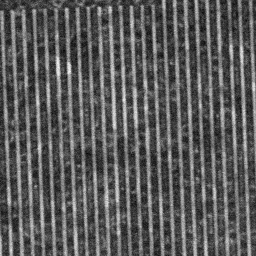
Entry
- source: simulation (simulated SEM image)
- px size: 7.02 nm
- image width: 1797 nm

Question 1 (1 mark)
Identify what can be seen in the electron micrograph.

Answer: parallel lines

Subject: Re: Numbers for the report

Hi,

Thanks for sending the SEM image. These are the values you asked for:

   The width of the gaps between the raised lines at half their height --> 60.5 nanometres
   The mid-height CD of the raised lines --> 16.7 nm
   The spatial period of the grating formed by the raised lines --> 76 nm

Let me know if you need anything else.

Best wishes